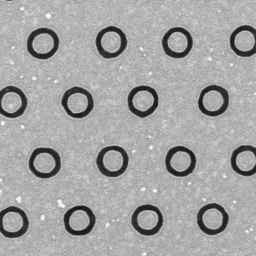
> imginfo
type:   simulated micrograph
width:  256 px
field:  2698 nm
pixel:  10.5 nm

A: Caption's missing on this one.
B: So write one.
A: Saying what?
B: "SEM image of a regular array of ring-shaped grooves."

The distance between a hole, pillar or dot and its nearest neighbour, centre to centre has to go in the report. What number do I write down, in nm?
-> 699